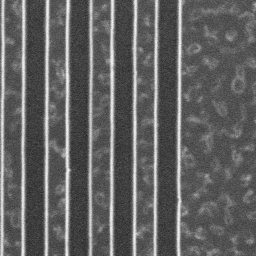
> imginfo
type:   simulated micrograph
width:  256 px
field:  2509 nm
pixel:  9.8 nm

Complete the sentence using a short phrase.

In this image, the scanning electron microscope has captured parallel lines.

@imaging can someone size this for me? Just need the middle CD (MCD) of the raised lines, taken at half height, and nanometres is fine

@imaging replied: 203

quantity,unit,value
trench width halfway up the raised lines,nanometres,232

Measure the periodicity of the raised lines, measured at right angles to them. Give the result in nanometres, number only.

433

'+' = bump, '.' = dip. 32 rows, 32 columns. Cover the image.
+++...++...+++...++....+++++++++
+++...++...+++...++....+++++++++
+++...++...+++...++....+++++++++
+++...++...+++...++....+++++++++
+++...++...+++...++....+++++++++
+++...++...+++...++....+++++++++
+++...++...+++...++....+++++++++
+++...++...+++...++....+++++++++
+++...++...+++...++...++++++++++
+++...++...+++...++...++++++++++
+++...++...+++...++...++++++++++
+++...++...+++...++...++++++++++
+++...++...+++...++...++++++++++
+++...++...+++...++...++++++++++
+++...++...+++...++...++++++++++
+++...++...+++...++...++++++++++
+++...++...+++...++...++++++++++
+++...++...+++...++...++++++++++
+++...++...+++...++...++++++++++
+++...++...+++...++...++++++++++
+++...++...+++...++...++++++++++
+++...++...+++...++...++++++++++
+++...++...+++...++...++++++++++
+++...++...+++...++...++++++++++
+++...++...+++...++...++++++++++
+++...++...+++...++...++++++++++
+++...++...+++...++...++++++++++
+++...++...+++...++...++++++++++
+++...++...+++...++...++++++++++
+++...++...+++...++...++++++++++
+++...++...+++...++...++++++++++
+++...++...+++...++...++++++++++